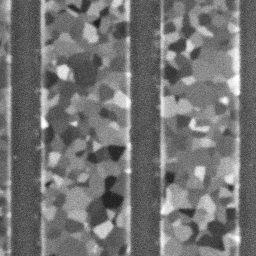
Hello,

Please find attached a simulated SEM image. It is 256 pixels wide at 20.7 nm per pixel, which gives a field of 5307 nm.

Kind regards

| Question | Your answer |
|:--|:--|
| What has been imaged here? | lines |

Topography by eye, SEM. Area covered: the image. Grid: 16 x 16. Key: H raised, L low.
HLLHHHHHLLHHHHHL
HLLHHHHHLLHHHHHL
HLLHHHHHLLHHHHHL
HLLHHHHHLLHHHHHL
HLLHHHHHLLHHHHHL
HLLHHHHHLLHHHHHL
HLLHHHHHLLHHHHHL
HLLHHHHHLLHHHHHL
HLLHHHHHLLHHHHHL
HLLHHHHHLLHHHHHL
HLLHHHHHLLHHHHHL
HLLHHHHHLLHHHHHL
HLLHHHHHLLHHHHHL
HLLHHHHHLLHHHHHL
HLLHHHHHLLHHHHHL
HLLHHHHHLLHHHHHL